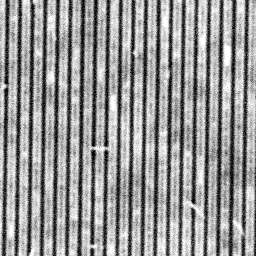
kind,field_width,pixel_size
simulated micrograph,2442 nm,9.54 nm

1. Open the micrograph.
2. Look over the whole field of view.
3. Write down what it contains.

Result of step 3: parallel lines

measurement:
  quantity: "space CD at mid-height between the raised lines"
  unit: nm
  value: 53.6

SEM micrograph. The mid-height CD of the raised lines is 0.0632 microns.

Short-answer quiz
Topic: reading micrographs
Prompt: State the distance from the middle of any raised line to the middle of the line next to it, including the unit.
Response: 120 nm